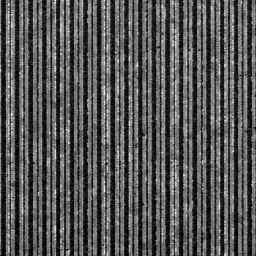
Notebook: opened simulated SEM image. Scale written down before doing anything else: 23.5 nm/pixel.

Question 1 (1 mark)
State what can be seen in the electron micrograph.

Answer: parallel lines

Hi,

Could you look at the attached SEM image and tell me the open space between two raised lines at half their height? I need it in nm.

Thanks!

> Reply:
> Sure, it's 108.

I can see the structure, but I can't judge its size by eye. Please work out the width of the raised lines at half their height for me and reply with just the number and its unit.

0.0762 um